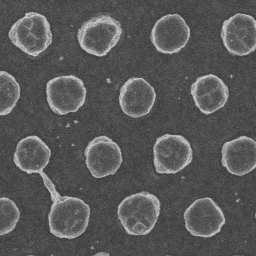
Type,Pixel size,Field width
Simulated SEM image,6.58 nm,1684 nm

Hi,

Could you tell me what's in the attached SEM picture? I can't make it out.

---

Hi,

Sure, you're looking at a regular array of raised bodies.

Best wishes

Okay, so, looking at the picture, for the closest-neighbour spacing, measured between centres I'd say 436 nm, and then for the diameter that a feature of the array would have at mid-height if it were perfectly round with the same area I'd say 247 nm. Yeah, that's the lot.